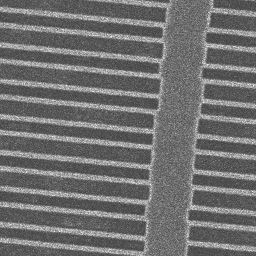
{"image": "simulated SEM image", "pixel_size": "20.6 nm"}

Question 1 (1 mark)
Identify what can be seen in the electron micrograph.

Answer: parallel lines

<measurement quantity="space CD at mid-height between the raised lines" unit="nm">236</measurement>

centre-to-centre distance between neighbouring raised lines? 365 nanometers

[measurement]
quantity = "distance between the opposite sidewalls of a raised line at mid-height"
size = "105 nanometres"